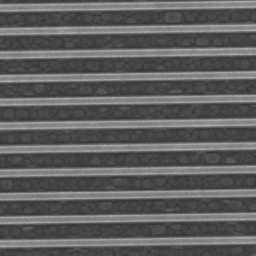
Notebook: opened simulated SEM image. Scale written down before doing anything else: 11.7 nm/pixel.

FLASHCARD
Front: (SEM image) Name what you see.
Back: parallel lines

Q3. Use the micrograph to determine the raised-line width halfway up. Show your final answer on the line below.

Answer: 7.49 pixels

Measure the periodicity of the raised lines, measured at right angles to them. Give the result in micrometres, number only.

0.276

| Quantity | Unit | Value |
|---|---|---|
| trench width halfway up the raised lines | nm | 187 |